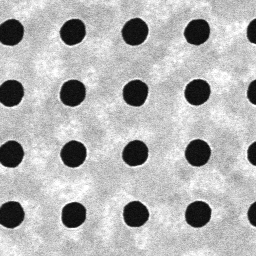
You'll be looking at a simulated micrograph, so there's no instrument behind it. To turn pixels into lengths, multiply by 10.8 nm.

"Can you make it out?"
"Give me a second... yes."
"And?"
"a regular array of holes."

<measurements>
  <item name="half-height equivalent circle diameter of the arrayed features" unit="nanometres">287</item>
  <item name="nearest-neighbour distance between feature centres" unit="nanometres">655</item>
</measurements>